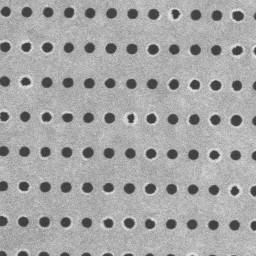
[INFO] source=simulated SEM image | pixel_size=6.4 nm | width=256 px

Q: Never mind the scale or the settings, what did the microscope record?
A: a regular array of holes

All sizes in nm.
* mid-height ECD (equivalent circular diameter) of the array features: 68.5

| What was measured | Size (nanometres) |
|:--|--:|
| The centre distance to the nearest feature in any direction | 134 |